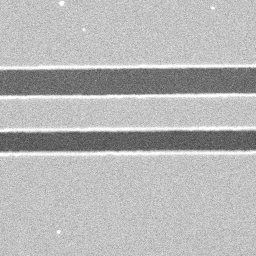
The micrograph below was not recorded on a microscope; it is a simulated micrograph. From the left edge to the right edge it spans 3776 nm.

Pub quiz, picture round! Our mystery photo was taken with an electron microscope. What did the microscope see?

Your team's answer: lines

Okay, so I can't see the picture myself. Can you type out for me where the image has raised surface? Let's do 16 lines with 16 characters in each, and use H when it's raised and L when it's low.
HHHHHHHHHHHHHHHH
HHHHHHHHHHHHHHHH
HHHHHHHHHHHHHHHH
HHHHHHHHHHHHHHHH
LLLLLLLLLLLLLLLL
LLLLLLLLLLLLLLLL
HHHHHHHHHHHHHHHH
HHHHHHHHHHHHHHHH
LLLLLLLLLLLLLLLL
LLLLLLLLLLLLLLLL
HHHHHHHHHHHHHHHH
HHHHHHHHHHHHHHHH
HHHHHHHHHHHHHHHH
HHHHHHHHHHHHHHHH
HHHHHHHHHHHHHHHH
HHHHHHHHHHHHHHHH